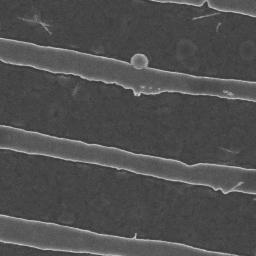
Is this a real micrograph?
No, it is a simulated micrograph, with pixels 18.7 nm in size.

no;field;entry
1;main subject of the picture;one or a few lines or trenches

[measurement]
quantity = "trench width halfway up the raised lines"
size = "1190 nanometers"